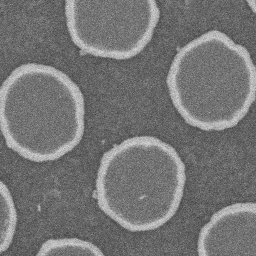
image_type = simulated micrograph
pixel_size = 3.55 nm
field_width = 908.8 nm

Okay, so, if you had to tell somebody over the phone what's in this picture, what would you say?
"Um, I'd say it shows raised bodies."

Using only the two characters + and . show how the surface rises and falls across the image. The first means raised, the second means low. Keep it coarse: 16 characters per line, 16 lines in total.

....++++++......
....++++++......
.....++++....+..
...........++++.
.++........+++++
+++++......+++++
+++++......+++++
+++++.......+++.
+++++...........
.+++...++++.....
......+++++.....
......+++++.....
+.....+++++.....
+......++++...++
+............+++
...+++.......+++